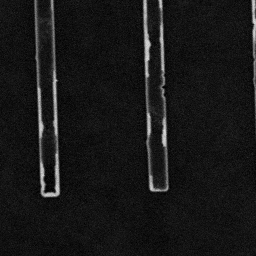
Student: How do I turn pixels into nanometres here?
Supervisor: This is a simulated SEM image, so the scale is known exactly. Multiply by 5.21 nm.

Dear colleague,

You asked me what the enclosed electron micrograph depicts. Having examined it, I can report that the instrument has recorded one or a few lines or trenches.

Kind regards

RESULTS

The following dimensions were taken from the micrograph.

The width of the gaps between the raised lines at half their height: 468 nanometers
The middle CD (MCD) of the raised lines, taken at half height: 95.1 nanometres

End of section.